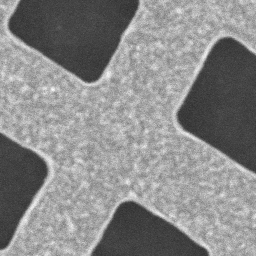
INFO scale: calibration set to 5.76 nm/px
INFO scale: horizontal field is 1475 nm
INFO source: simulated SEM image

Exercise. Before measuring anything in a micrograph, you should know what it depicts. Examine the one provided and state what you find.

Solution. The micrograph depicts holes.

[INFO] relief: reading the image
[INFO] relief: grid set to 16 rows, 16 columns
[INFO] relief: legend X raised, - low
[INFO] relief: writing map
X--------XXXXXXX
--------XXXXXXXX
X-------XXXXXX-X
XXX----XXXXXX---
XXXX---XXXXX----
XXXXXXXXXXXX----
XXXXXXXXXXX-----
XXXXXXXXXXX-----
XXXXXXXXXXXX----
--XXXXXXXXXXXX--
---XXXXXXXXXXXX-
---XXXXXXXXXXXXX
--XXXXXXXXXXXXXX
-XXXXXX---XXXXXX
-XXXXX-----XXXXX
XXXXXX-------XXX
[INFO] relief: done